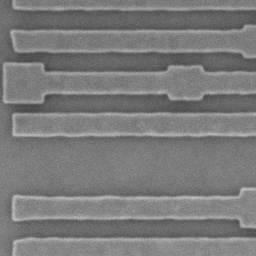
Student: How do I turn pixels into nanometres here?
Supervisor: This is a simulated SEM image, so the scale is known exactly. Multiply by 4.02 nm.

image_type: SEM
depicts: wiring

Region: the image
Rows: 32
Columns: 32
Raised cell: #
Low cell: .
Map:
..##############################
................................
................................
..............................##
.###############################
..##############################
..##..##............###......###
................................
#####................####.......
################################
################################
.###############################
.####...........................
................................
..##############################
..##############################
..##############################
................................
................................
................................
................................
................................
................................
................................
..#...........................##
..##############################
..##############################
..#...........................##
................................
................................
..##############################
..##############################